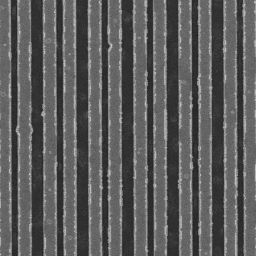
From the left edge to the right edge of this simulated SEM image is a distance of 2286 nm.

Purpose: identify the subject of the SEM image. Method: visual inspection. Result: parallel lines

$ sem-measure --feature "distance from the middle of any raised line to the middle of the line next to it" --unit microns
0.204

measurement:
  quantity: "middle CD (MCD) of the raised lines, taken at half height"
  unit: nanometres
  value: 120